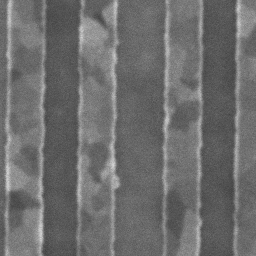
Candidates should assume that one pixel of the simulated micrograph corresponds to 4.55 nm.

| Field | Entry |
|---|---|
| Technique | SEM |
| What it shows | lines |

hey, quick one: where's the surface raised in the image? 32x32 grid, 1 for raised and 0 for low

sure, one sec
01111100001111100000011110000011
01111100001111000000011110000011
01111100001111000000011110000011
01111100001111000000011110000011
01111100001111100000011110000011
01111100001111000000011110000011
01111100001111000000011110000011
01111000001111000000011110000011
01111000001111000000011110000011
01111000001111000000011110000011
01111100001111000000011110000011
01111000001111000000011110000011
01111000001111000000011110000011
01111000001111000000011110000011
01111000001111000000011110000011
01111000001111000000011110000011
01111000001111000000011110000011
01111000001111000000011110000011
01111000001111000000011110000111
01111000001111000000011110000111
01111000001111000000011110000111
01111000001111000000011110000111
01111000001111000000111110000111
01111000001111000000011110000111
01111000001111000000011110000111
01111000001111000000011110000111
01111000001111000000111110000111
01111000001111000000011110000111
01111000001111000000111110000111
01111000001111000000011110000111
01111000001111000000011110000111
01111000001111000000011110000111